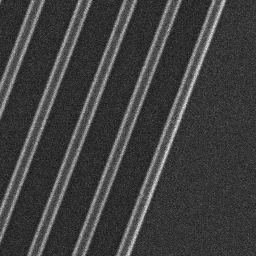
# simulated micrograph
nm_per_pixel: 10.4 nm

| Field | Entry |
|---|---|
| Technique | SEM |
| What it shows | parallel lines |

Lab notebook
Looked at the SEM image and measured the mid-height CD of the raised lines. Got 108 nanometres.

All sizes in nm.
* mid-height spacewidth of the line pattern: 324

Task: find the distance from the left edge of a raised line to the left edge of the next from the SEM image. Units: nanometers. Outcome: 436